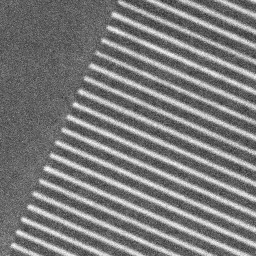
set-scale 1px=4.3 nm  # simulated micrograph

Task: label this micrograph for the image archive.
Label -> parallel lines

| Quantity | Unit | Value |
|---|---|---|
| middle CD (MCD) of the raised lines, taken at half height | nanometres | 15.2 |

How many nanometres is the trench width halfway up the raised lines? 46.7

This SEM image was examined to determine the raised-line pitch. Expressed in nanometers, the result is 60.2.